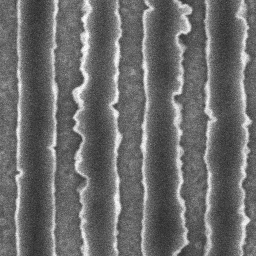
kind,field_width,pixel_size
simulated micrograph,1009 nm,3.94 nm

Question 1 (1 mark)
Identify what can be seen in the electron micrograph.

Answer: one or a few lines or trenches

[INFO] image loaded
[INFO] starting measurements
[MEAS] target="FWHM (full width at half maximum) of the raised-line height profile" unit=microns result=0.147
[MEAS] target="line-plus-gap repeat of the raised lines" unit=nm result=249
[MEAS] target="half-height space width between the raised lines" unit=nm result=103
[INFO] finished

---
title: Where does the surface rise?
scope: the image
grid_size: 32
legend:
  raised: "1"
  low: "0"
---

00111110000111100011111000111100
00111110000111100011111100111100
00111110001111100011111000111110
00111110000111100011111100111110
00111110000111100011110000111110
00111110000111100011110000111110
00111110001111100011111000111110
00111110001111100011111000111110
00111110001111100011111000111110
00111110000111100011111000111110
00111110001111100011111000111100
00111110011111100011111000111100
00111110001111100011110000111110
00111110001111000011110000111110
00111110011111100011110000111110
00111110011111100011110000111110
00111110001111100011111000111110
00111110001111100011110000111110
00111110001111100011110000111110
00111110001111100011110000111110
00111110011111100011111000111110
00111110001111100011111000111110
00111110000111100011111000111100
00111110000111100011111000111100
00111110001111100011111000111110
00111110001111100011111000111100
00111110001111100011111000111100
00111110001111100011111000111110
00111110001111100011111000111100
00111110001111000011111000111110
00111110001111100011111000111100
00111110000111100011110000111100